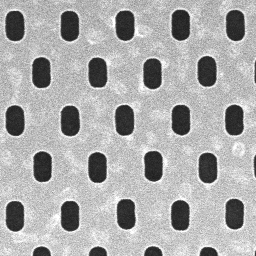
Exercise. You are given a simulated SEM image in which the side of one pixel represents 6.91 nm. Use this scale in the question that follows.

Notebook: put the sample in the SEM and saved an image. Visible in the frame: a regular array of holes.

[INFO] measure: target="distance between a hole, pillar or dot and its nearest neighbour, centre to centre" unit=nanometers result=372